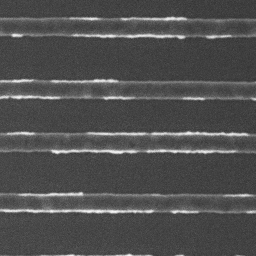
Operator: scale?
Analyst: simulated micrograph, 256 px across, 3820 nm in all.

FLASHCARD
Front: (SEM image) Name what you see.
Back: parallel lines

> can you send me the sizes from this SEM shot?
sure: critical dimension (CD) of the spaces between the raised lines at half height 634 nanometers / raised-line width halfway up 270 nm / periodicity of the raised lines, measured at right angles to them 0.874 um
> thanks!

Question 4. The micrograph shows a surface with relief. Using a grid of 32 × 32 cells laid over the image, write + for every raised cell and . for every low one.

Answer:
................................
................................
++++++++++++++++++++++++++++++++
++++++++++++++++++++++++++++++++
.++........+++++++++++++++++++++
................................
................................
................................
................................
................................
++++++++++++++++++++++++++++++++
++++++++++++++++++++++++++++++++
................................
................................
................................
................................
.......................+........
+++++++++++.++++++++++++++++++++
++++++++++++++++.+++++++++++++++
................................
................................
................................
................................
................................
++++++++++++++++++++++++++++++++
++++++++++++++++++++++++++++++++
......+...+++++.+++..++++..+++++
................................
................................
................................
................................
................................